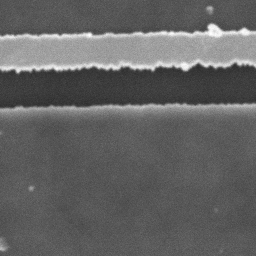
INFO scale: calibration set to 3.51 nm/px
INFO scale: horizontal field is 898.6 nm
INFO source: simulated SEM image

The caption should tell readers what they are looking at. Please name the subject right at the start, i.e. lines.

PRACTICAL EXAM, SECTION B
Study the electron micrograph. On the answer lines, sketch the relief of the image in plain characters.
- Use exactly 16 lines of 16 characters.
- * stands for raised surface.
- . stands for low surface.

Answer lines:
****************
****************
****************
****************
................
................
................
****************
****************
****************
****************
****************
****************
****************
****************
****************